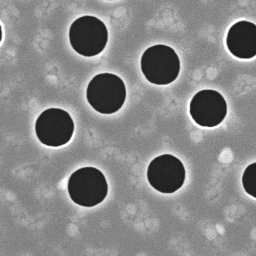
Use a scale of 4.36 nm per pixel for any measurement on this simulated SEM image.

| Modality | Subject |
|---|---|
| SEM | holes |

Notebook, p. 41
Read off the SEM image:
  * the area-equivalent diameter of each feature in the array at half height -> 174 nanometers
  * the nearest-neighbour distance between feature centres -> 270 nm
